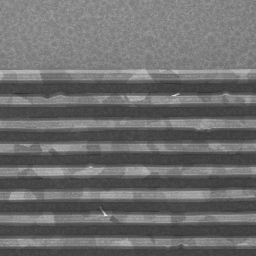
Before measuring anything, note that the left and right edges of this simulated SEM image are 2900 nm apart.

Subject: parallel lines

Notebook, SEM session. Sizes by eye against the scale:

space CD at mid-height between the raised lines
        0.161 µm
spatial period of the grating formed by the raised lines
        0.269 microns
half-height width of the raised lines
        100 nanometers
